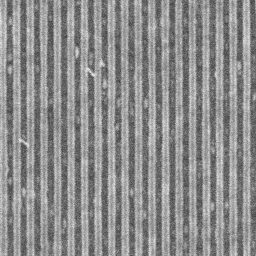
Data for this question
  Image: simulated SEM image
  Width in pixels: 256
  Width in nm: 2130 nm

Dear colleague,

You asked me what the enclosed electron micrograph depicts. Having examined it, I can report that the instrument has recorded parallel lines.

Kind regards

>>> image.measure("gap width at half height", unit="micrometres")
0.0624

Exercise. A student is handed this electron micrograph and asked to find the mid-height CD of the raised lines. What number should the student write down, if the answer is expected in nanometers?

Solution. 48.9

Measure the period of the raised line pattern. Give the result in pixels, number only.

13.5